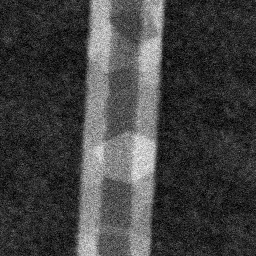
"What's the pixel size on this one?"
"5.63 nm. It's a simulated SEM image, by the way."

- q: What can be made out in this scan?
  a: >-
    one or a few lines or trenches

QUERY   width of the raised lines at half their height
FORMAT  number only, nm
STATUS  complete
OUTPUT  280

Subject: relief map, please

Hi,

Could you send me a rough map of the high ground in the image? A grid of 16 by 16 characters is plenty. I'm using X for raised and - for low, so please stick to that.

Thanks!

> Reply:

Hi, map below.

------XXXX------
------XXXX------
------XXX-------
------XXX-------
------XXX-------
------XXX-------
------XXX-------
------XXX-------
------XXX-------
------XXX-------
------XXX-------
------XXX-------
------XXX-------
------XXX-------
------XXX-------
------XXX-------